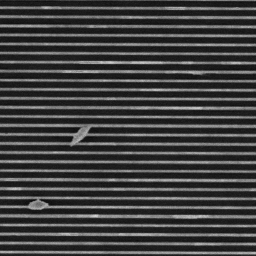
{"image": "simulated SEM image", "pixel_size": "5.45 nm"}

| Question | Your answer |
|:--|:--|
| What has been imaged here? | parallel lines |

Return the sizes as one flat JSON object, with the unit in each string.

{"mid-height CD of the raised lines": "15 nanometres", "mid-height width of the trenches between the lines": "30.7 nanometres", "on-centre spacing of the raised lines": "49.4 nanometers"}